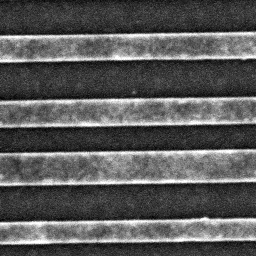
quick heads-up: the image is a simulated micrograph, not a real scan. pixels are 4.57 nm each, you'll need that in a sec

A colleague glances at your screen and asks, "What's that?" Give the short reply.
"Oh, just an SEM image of one or a few lines or trenches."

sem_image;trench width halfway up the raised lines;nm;170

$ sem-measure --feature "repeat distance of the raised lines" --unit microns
0.28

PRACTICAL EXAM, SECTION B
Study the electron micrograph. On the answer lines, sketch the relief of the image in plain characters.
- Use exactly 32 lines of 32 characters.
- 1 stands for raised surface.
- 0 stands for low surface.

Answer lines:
00000000000000000000000000000000
00000000000000000000000000000000
00000000000000000000000000000000
00000000000000000000000000000000
00000000111111111111111111111111
11111111111111111111111111111111
11111111111111111111111111111111
11111111110000000000000000000000
00000000000000000000000000000000
00000000000000000000000000000000
00000000000000000000000000000000
00000000000000000000000000000000
00000000000000000111111111111111
11111111111111111111111111111111
11111111111111111111111111111111
11111111111111111110000000000000
00000000000000000000000000000000
00000000000000000000000000000000
00000000000000000000000000000000
11111111111111111111111111111111
11111111111111111111111111111111
11111111111111111111111111111111
11111111111111111111111111111111
00000000000000000000000000000000
00000000000000000000000000000000
00000000000000000000000000000000
00000000000000000000000000000000
00000000000000000000000001100001
11111111111111111111111111111111
11111111111111111111111111111111
00000000000000000000000000000000
00000000000000000000000000000000